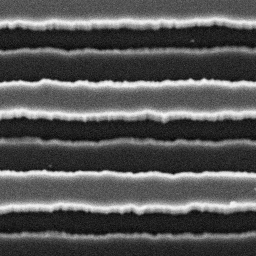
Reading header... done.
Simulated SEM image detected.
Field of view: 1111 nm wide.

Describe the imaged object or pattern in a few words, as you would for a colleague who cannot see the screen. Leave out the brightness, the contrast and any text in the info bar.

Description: lines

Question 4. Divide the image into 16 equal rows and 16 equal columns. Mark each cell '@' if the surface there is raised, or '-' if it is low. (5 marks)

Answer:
@@@@@@@@@@@@@@@@
@-@-@@----------
----------------
----------------
----------------
@@@@@@@@@@@@@@@@
@@@@@@@@@@@@@@@@
----------------
----------------
----------------
----------------
@@@@@@@@@@@@@@@@
@@@@@@@@@@@@@@@@
----------------
----------------
----------------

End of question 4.